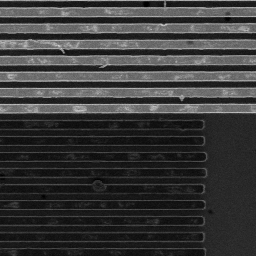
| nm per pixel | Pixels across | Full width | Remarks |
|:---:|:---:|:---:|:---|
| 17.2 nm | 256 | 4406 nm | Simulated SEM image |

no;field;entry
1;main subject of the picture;parallel lines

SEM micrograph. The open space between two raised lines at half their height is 125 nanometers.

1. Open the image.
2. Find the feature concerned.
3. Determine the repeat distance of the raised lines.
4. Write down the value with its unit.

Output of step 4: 277 nanometers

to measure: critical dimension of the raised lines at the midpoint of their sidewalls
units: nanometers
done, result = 155